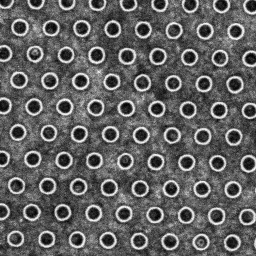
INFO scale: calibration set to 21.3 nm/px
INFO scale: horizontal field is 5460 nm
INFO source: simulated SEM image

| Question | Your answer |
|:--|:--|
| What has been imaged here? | a regular array of raised bodies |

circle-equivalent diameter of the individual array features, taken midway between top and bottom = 0.325 um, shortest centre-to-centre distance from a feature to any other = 643 nm